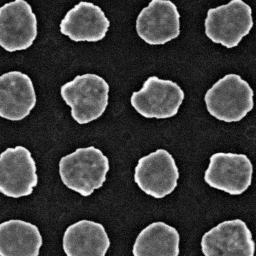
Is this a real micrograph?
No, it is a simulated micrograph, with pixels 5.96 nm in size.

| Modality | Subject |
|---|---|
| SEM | raised bodies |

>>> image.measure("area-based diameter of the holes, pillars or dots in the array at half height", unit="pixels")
44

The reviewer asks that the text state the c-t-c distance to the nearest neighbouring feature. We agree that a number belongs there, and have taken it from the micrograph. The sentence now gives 432 nanometers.